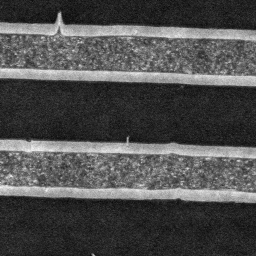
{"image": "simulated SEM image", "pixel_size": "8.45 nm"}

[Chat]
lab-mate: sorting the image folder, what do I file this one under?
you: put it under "one or a few lines or trenches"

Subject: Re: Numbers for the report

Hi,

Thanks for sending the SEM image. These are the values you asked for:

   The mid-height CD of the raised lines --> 389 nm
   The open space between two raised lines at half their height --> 598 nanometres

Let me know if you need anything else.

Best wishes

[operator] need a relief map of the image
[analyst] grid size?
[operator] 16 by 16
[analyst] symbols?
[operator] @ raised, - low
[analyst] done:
----------------
----------------
@@@@@@@@@@@@@@@@
@@@@@@@@@@@@@@@@
@@@@@@@@@@@@@@@@
----------------
----------------
----------------
----------------
@@@@@@@@@@@@@@@-
@@@@@@@@@@@@@@@@
@@@@@@@@@@@@@@@@
----------------
----------------
----------------
----------------